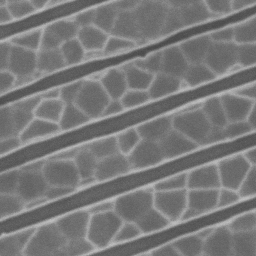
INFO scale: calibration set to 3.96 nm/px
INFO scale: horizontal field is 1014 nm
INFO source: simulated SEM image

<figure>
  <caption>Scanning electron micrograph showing one or a few lines or trenches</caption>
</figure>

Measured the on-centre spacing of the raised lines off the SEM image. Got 241 nm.